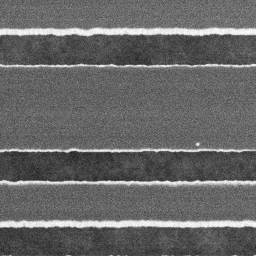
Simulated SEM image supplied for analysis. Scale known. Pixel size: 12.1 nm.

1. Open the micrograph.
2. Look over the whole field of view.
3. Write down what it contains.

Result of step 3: lines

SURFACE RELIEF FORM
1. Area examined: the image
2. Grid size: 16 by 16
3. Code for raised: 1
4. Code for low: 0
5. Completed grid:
1111111111111111
1111111111111111
0000000000000000
0000000000000000
1111111111111111
1111111111111111
1111111111111111
1111111111111111
1111111111111111
0000000000000000
0000000000000000
1111111111111111
1111111111111111
1111111111111111
0000000000000000
0000000000000000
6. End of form